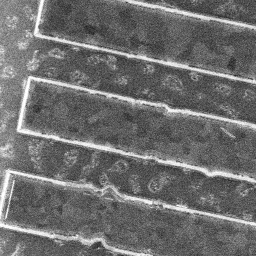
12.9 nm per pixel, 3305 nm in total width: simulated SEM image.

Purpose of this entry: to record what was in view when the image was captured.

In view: one or a few lines or trenches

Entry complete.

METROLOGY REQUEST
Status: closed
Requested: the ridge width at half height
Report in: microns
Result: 0.687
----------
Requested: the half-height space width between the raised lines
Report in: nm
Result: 554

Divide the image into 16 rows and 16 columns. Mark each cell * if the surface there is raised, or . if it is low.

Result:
...*******......
..*************.
....************
........********
.............***
..***...........
..*******.......
.*************..
...*************
........********
............****
****............
*********.......
*************...
..**************
.......*********